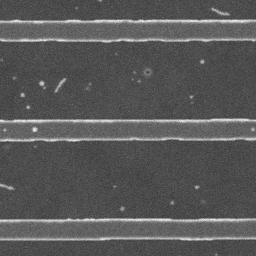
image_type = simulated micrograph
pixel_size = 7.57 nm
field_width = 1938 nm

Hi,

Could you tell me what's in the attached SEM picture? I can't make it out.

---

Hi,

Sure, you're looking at lines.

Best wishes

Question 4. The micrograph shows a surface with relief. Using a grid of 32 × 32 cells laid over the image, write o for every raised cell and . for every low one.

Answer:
................................
................................
................................
oooooooooooooooooooooooooooooooo
oooooooooooooooooooooooooooooooo
................................
................................
................................
................................
................................
................................
................................
................................
................................
................................
oooooooooooooooooooooooooooooooo
oooooooooooooooooooooooooooooooo
ooooooo.oo......................
................................
................................
................................
................................
................................
................................
................................
................................
................................
..........oooooooooooo...ooooooo
oooooooooooooooooooooooooooooooo
oooooooooooooooooooooooooooooooo
................................
................................